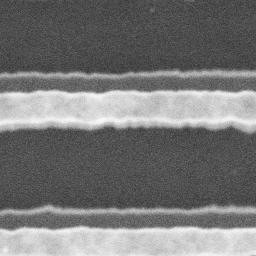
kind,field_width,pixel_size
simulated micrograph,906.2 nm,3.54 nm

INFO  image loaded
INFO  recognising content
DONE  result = lines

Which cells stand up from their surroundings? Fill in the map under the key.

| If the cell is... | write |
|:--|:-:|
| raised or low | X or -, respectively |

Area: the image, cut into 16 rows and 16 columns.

----------------
----------------
----------------
----------------
----------------
XXXXXXXXXXXXXXXX
XXXXXXXXXXXXXXXX
XXXXXXXXXXXXXXXX
----------------
----------------
----------------
----------------
----------------
XXXXXXXXXXXXXXXX
XXXXXXXXXXXXXXXX
XXXXXXXXXXXXXXXX